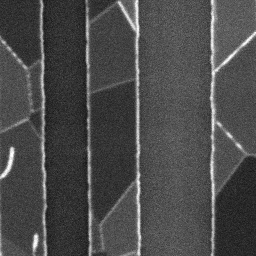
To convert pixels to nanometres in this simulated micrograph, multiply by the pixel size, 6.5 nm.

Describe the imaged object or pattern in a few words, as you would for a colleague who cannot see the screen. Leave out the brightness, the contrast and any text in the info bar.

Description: lines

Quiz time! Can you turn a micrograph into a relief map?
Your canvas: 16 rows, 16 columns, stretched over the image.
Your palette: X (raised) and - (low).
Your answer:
XXX--XXXX----XXX
XXX--XXXX----XXX
XXX--XXXX----XXX
XXX--XXXX----XXX
XXX--XXXX----XXX
XXX--XXXX----XXX
XXX--XXXX----XXX
XXX--XXXX----XXX
XXX---XXX----XXX
XXX---XXX----XXX
XXX---XXX----XXX
XXX---XXX----XXX
XXX---XXX----XXX
XXX---XXX----XXX
XXX---XXX----XXX
XXX---XXX----XXX